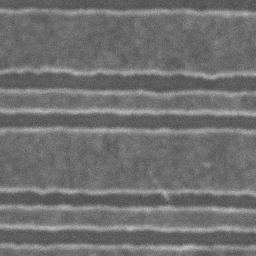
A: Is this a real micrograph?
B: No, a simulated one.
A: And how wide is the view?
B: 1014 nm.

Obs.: lines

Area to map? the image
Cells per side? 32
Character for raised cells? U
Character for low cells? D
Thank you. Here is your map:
DDDDDDDDDDDDDDDDDDDDDDDDDDDDDDDD
UUUUUUUUUUUUUUUDUUUUUUUUUDUUUDDD
UUUUUUUUUUUUUUUUUUUUUUUUUUUUUUUU
UUUUUUUUUUUUUUUUUUUUUUUUUUUUUUUU
UUUUUUUUUUUUUUUUUUUUUUUUUUUUUUUU
UUUUUUUUUUUUUUUUUUUUUUUUUUUUUUUU
UUUUUUUUUUUUUUUUUUUUUUUUUUUUUUUU
UUUUUUUUUUUUUUUUUUUUUUUUUUUUUUUU
UUUUUUUUUUUUUUUUUUUUUUUUUUUUUUUU
DDDDDDDDDDDDDDDDDDDDDDDDUUUUUDDD
DDDDDDDDDDDDDDDDDDDDDDDDDDDDDDDD
UUUUUUUUUUUUUUUUUUUDDDUUUUUUDDUD
UUUUUUUUUUUUUUUUUUUUUUUUUUUUUUUU
UUUUUUUUUUUUUUUUUUUUUUUUUUUUUUUU
DDDDDDDDDDDDDDDDDDDDDDDDDDDDDDDD
DDDDDDDDDDDDDDDDDDDDDDDDDDDDDDDD
UUUUUUUUUUUUUUUUUUUUUUUUUUUUUUUU
UUUUUUUUUUUUUUUUUUUUUUUUUUUUUUUU
UUUUUUUUUUUUUUUUUUUUUUUUUUUUUUUU
UUUUUUUUUUUUUUUUUUUUUUUUUUUUUUUU
UUUUUUUUUUUUUUUUUUUUUUUUUUUUUUUU
UUUUUUUUUUUUUUUUUUUUUUUUUUUUUUUU
UUUUUUUUUUUUUUUUUUUUUUUUUUUUUUUU
UUUUUUUUUUUUUUUUUUUUUUUUUUUUUUUU
DDDDDDDDDDDDDDDDDDDDDDDDDDDDDDDD
DDDDDDDDDDDDDDDDDDDDDDDDDDDDDDDD
UUUUUUUUUUUUUUUUUUUUUUUUUUUUUUUU
UUUUUUUUUUUUUUUUUUUUUUUUUUUUUUUU
DDDDUUUUDDUUUUUUUUUUUUUUUUUUUUUU
DDDDDDDDDDDDDDDDDDDDDDDDDDDDDDDD
DDDDDDDDDDDDDDDDDDDDDDDDDDDDDDDD
UUUUUUUUUUUUUUUUUUUUUUUUUUUUUUUU